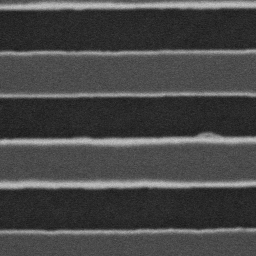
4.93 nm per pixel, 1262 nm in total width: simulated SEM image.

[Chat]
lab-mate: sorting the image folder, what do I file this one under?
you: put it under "lines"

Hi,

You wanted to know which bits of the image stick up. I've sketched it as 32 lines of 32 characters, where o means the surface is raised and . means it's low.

oooooooooooooooooooooooooooooooo
................................
................................
................................
................................
................................
oo.ooooo..ooo..ooooooooooooooooo
oooooooooooooooooooooooooooooooo
oooooooooooooooooooooooooooooooo
oooooooooooooooooooooooooooooooo
oooooooooooooooooooooooooooooooo
oooooooooooooooooooooooooooooooo
................................
................................
................................
................................
................................
..........oo..o.oooooooooooooooo
oooooooooooooooooooooooooooooooo
oooooooooooooooooooooooooooooooo
oooooooooooooooooooooooooooooooo
oooooooooooooooooooooooooooooooo
oooooooooooooooooooooooooooooooo
................................
................................
................................
................................
................................
................................
oooooooooooooooooooooooooooooooo
oooooooooooooooooooooooooooooooo
oooooooooooooooooooooooooooooooo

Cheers